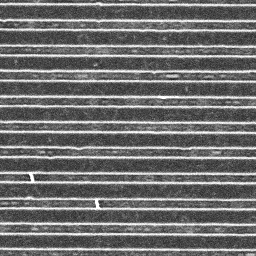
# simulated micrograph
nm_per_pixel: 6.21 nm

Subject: parallel lines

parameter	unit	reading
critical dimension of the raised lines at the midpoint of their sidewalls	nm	102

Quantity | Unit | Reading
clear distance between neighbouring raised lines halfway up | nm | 54.3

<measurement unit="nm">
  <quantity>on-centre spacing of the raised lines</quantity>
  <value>158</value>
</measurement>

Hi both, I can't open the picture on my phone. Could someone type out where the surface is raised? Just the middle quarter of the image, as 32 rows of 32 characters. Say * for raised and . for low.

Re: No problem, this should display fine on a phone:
********************************
********************************
................................
................................
********************************
********************************
********************************
********************************
................................
................................
................................
********************************
********************************
********************************
*****..*.......*..**************
................................
................................
********************************
********************************
********************************
********************************
................................
................................
************************....*.*.
********************************
********************************
********************************
................................
................................
................................
********************************
********************************